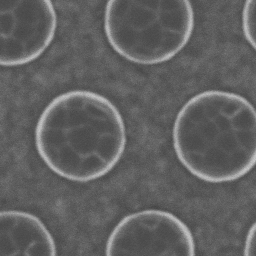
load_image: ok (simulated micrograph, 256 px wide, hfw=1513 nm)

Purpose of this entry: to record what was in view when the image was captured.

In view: raised bodies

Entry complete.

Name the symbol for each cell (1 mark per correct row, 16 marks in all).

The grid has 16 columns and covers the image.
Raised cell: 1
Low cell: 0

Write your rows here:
1110000111110001
1110000111110001
1110000111110000
1100000011100000
0000000000000000
0000000000000000
0001111000001110
0001111100011111
0011111100011111
0001111100011111
0001111000001110
0000000000000000
0000000000000000
1100000011100000
1110000111110000
1110000111110001